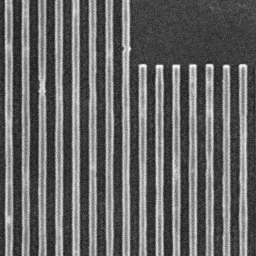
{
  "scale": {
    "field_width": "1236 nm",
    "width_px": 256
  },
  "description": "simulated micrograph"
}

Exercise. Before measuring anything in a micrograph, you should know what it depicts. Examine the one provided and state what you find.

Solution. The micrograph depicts parallel lines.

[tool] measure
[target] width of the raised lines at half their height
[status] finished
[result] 0.0314 microns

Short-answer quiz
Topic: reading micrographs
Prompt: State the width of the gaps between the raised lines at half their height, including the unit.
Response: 49.5 nanometres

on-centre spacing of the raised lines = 80.8 nanometres